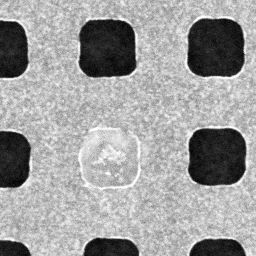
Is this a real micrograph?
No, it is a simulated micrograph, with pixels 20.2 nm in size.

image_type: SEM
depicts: holes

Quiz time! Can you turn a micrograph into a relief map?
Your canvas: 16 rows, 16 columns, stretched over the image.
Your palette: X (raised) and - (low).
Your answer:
XXXXXXXXXXXXXXXX
-XXXX---XXXX---X
--XXX---XXXX---X
--XXX----XXX---X
-XXXX---XXXX---X
XXXXXXXXXXXXXXXX
XXXXXXXXXXXXXXXX
XXXXXXXXXXXXXXXX
-XXXXXXXXXXX---X
--XXXXXXXXXX---X
--XXXXXXXXXX---X
-XXXXXXXXXXX---X
XXXXXXXXXXXXXXXX
XXXXXXXXXXXXXXXX
XXXXXXXXXXXXXXXX
--XXX----XXX---X